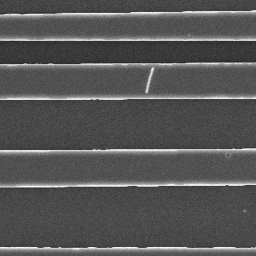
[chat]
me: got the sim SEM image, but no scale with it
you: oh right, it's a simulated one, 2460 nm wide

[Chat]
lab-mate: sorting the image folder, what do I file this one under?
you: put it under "lines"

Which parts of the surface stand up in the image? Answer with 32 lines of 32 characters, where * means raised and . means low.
................................
..........................******
********************************
********************************
********************************
................................
................................
................................
********************************
********************************
********************************
********************************
................................
................................
................................
................................
................................
................................
................................
********************************
********************************
********************************
********************************
................................
................................
................................
................................
................................
................................
................................
................................
********************************